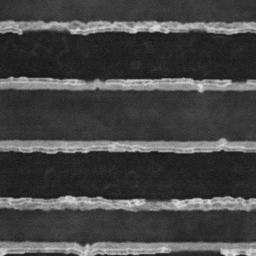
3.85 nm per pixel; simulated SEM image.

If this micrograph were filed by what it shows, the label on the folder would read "one or a few lines or trenches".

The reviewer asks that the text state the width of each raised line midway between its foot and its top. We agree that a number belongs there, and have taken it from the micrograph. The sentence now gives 238 nm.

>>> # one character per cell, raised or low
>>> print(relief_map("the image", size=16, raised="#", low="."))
................
................
################
################
################
................
................
................
................
################
################
################
################
................
................
#####.##########